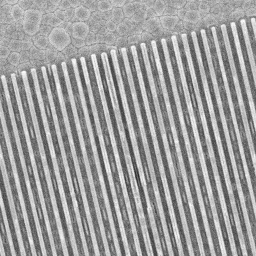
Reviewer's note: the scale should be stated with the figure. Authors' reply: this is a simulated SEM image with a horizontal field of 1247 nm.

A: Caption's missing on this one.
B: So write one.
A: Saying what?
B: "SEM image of parallel lines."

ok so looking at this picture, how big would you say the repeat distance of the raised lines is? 49.9 nm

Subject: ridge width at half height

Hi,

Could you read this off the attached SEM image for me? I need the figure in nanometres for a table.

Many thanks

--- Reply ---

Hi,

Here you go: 21.4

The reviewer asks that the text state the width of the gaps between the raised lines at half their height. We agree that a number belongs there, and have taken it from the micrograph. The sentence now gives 29.6 nanometers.